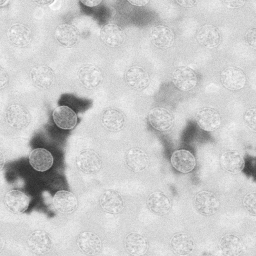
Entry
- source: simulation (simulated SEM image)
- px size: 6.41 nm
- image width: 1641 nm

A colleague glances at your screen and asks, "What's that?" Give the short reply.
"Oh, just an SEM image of a regular array of raised bodies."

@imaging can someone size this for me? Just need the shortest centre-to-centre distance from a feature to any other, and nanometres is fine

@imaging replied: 301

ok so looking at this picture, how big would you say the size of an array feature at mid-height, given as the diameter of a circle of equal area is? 0.143 microns